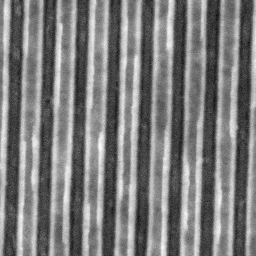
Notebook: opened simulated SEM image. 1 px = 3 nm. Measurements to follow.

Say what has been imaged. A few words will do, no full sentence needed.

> parallel lines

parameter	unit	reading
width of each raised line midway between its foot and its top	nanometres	49.5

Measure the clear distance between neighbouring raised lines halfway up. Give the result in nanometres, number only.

49.5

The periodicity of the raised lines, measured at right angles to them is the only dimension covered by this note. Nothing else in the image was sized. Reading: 32.7 px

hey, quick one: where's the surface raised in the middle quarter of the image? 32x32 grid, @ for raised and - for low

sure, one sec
@@-----@@@-----@@@-----@@@@----@
@@-----@@@-----@@@-----@@@-----@
@@----@@@@-----@@@-----@@@-----@
@@----@@@@----@@@@-----@@@-----@
@@----@@@@----@@@@-----@@@-----@
@@----@@@@-----@@@-----@@@@----@
@@----@@@@-----@@@-----@@@@----@
@@----@@@@----@@@@-----@@@@----@
@@----@@@@----@@@@-----@@@@----@
@@----@@@@----@@@@-----@@@-----@
@@----@@@@----@@@@-----@@@-----@
@@----@@@@----@@@@-----@@@-----@
@@----@@@@----@@@@----@@@@-----@
@@----@@@@----@@@@----@@@@-----@
@@----@@@@----@@@@----@@@@-----@
@@----@@@@----@@@@----@@@@-----@
@-----@@@@----@@@@----@@@@-----@
@-----@@@@----@@@@----@@@@-----@
@-----@@@@----@@@@----@@@@-----@
@-----@@@@----@@@@----@@@@-----@
@-----@@@@----@@@@----@@@@----@@
@-----@@@@----@@@@----@@@@----@@
@-----@@@@----@@@@----@@@@----@@
@-----@@@@----@@@@----@@@@----@@
@-----@@@-----@@@@----@@@@----@@
@-----@@@-----@@@-----@@@@----@@
@-----@@@-----@@@-----@@@@----@@
@-----@@@-----@@@-----@@@@----@@
@-----@@@-----@@@-----@@@@----@@
@-----@@@-----@@@-----@@@@----@@
@-----@@@-----@@@-----@@@@----@@
@-----@@@-----@@@-----@@@@----@@